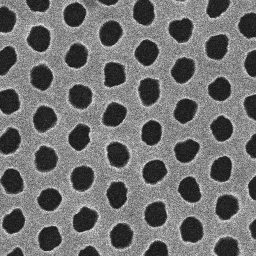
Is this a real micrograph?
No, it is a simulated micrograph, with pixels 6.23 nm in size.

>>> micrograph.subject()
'a regular array of holes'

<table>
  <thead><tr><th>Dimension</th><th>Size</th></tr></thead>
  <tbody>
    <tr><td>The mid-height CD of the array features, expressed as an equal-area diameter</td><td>0.144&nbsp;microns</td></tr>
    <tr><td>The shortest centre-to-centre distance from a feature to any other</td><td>244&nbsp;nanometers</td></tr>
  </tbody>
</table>